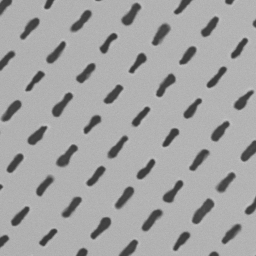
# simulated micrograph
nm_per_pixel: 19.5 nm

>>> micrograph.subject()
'a regular array of holes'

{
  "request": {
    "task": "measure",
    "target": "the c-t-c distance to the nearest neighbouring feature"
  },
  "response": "680 nm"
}